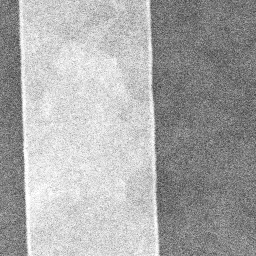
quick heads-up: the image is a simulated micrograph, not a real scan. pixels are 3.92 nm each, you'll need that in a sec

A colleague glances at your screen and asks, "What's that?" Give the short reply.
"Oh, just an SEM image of one or a few lines or trenches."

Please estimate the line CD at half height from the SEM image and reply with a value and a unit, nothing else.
503 nm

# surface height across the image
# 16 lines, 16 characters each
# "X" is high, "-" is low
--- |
-XXXXXXXX-------
-XXXXXXXX-------
-XXXXXXXX-------
-XXXXXXXX-------
-XXXXXXXX-------
-XXXXXXXX-------
--XXXXXXX-------
--XXXXXXXX------
--XXXXXXXX------
--XXXXXXXX------
--XXXXXXXX------
--XXXXXXXX------
--XXXXXXXX------
--XXXXXXXX------
--XXXXXXXX------
--XXXXXXXX------